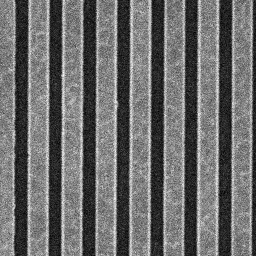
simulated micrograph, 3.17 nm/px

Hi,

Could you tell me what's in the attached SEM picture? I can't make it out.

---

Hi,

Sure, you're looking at parallel lines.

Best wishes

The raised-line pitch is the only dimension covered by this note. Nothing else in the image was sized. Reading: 0.108 micrometres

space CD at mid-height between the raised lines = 46 nm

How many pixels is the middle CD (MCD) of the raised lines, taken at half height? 19.9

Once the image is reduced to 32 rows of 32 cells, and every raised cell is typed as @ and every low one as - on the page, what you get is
@@--@@--@@--@@@-@@@--@@--@@--@@-
@@--@@--@@--@@@-@@@--@@--@@--@@-
@@--@@--@@--@@@-@@@--@@--@@--@@-
@@--@@--@@--@@@-@@@--@@--@@--@@-
@@--@@--@@--@@@-@@@--@@--@@--@@-
@@--@@--@@--@@@-@@@--@@--@@--@@-
@@--@@--@@--@@--@@@--@@--@@--@@-
@@--@@--@@--@@--@@@--@@--@@--@@-
@@--@@--@@--@@--@@@--@@--@@--@@-
@@--@@--@@--@@--@@@--@@--@@--@@-
@@--@@--@@--@@--@@@--@@--@@--@@-
@@--@@--@@--@@--@@@--@@--@@--@@-
@@--@@--@@--@@@-@@@--@@--@@--@@-
@@--@@--@@--@@@-@@@--@@--@@--@@-
@@--@@--@@--@@--@@@--@@--@@--@@-
@@--@@--@@--@@--@@@--@@--@@--@@-
@@--@@--@@--@@--@@@--@@--@@--@@-
@@--@@--@@--@@--@@@--@@--@@--@@-
@@--@@--@@--@@--@@@--@@--@@--@@-
@@--@@--@@--@@--@@@--@@--@@--@@-
@@--@@--@@--@@--@@@--@@--@@--@@-
@@--@@--@@--@@--@@@--@@--@@--@@-
@@--@@--@@--@@--@@@--@@--@@--@@-
@@--@@--@@--@@--@@@--@@--@@--@@-
@@--@@--@@--@@--@@@--@@--@@--@@-
@@--@@--@@--@@--@@@--@@--@@--@@-
@@--@@--@@--@@--@@@--@@--@@--@@-
@@--@@--@@--@@--@@@--@@--@@--@@-
@@--@@--@@--@@--@@@--@@--@@--@@-
@@--@@--@@--@@--@@@--@@--@@--@@-
@@--@@--@@--@@--@@@--@@--@@--@@-
@@--@@--@@--@@--@@@--@@--@@--@@-